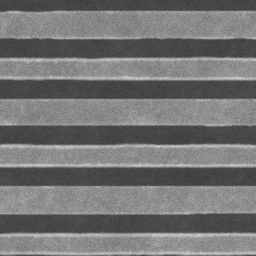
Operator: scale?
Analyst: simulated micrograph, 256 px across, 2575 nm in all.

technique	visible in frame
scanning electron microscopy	lines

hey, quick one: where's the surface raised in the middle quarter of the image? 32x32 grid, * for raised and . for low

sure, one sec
********************************
********************************
********************************
********************************
................................
................................
................................
................................
................................
********************************
********************************
********************************
********************************
********************************
********************************
................................
................................
................................
................................
................................
********************************
********************************
********************************
********************************
********************************
********************************
................................
................................
................................
................................
................................
********************************